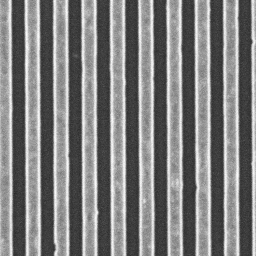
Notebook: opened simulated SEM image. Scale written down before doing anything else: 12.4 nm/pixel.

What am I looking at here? parallel lines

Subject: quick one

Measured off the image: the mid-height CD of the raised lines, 168 nm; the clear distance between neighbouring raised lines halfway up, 181 nm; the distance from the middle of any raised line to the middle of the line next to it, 0.35 microns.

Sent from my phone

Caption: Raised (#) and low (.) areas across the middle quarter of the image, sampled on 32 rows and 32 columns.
#....###....###....###....###...
#....###....###....###....###...
#....###....###....###....###...
#....###....###....###....###...
#....###....###....###....###...
#....###....###....###....###...
#....###....###....###....###...
#....###....###....###....###...
#....###....###....###....###...
#....###....###....###....###...
#....###....###....###....###...
#....###....###....###....###...
#....###....###....###....###...
#....###....###....###....###...
#....###....###....###....###...
#....###....###....###....###...
#....###....###....###....###...
#....###....###....###....###...
#....###....###....###....###...
#....###....###....###....###...
#....###....###....###....###...
#....###....###....###....###...
#....###....###....###....###...
#....###....###....###....###...
#....###....###....###....###...
#....###....###....###....###...
#....###....###....###....###...
#....###....###....###....###...
#....###....###....###....###...
#....###....###....###....###...
#....###....###....###....###...
#....###....###....###....###...